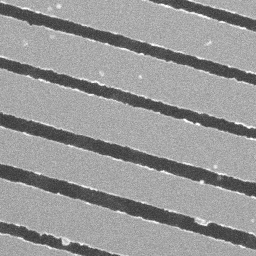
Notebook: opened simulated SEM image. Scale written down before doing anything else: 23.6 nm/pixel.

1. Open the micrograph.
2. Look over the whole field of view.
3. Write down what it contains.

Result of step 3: parallel lines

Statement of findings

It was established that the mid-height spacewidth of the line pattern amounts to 285 nm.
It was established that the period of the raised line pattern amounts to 1240 nm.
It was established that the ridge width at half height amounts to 970 nm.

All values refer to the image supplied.